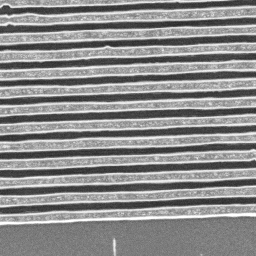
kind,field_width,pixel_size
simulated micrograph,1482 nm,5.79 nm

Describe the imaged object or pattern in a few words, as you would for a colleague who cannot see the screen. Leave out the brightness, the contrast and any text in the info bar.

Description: parallel lines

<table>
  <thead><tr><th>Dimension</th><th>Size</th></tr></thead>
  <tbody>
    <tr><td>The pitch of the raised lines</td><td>104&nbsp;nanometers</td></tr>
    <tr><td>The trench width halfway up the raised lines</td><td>8.24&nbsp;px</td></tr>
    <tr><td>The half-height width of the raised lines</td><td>58.5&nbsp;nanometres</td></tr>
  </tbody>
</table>